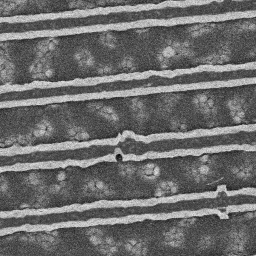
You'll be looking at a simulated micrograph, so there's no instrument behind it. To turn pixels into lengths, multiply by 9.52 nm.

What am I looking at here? one or a few lines or trenches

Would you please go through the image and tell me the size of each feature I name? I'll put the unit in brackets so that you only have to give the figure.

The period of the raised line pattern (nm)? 610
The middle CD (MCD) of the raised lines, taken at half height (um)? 0.16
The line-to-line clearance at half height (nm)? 448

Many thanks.